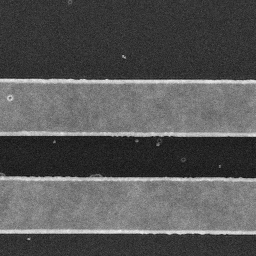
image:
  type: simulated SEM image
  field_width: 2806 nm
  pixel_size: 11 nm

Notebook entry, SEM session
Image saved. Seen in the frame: lines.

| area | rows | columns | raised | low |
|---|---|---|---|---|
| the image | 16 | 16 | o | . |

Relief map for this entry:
................
................
................
................
................
oooooooooooooooo
oooooooooooooooo
oooooooooooooooo
.......ooooooooo
................
................
oooooooooooooooo
oooooooooooooooo
oooooooooooooooo
oooooooooooooooo
................